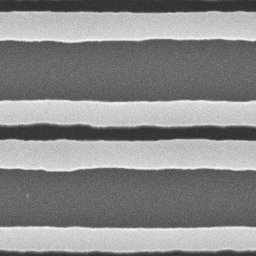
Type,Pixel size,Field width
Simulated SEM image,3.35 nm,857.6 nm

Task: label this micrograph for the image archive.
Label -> lines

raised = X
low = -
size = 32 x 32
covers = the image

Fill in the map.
--------------------------------
-XXXXXX---X--------------XXX-XX-
XXXXXXXXXXXXXXXXXXXXXXXXXXXXXXXX
XXXXXXXXXXXXXXXXXXXXXXXXXXXXXXXX
XXXXXXXXXXXXXXXXXXXXXXXXXXXXXXXX
--------------------------------
--------------------------------
--------------------------------
--------------------------------
--------------------------------
--------------------------------
--------------------------------
--------------------------------
XXXXXXXXXXXXXXXXXXXXXXXXXXXXXXXX
XXXXXXXXXXXXXXXXXXXXXXXXXXXXXXXX
XXXX---XX-XXXXXXXXXXXXXXXXXXXXXX
--------------------------------
XXX----XX------------XXXXX------
XXXXXXXXXXXXXXXXXXXXXXXXXXXXXXXX
XXXXXXXXXXXXXXXXXXXXXXXXXXXXXXXX
XXXXXXXXXXXXXXXXXXXXXXXXXXXXXXXX
--------------------------------
--------------------------------
--------------------------------
--------------------------------
--------------------------------
--------------------------------
--------------------------------
XXXXXXX-XXX---------------XXXXXX
XXXXXXXXXXXXXXXXXXXXXXXXXXXXXXXX
XXXXXXXXXXXXXXXXXXXXXXXXXXXXXXXX
--------------XX----------------